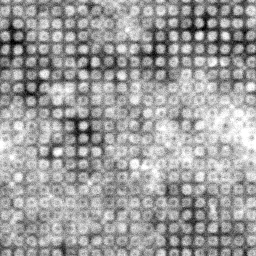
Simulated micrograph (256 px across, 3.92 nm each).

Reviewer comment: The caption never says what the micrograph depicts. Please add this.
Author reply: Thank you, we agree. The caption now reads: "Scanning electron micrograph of a regular array of raised bodies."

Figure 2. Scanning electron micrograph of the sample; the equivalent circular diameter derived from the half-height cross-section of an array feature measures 0.0345 microns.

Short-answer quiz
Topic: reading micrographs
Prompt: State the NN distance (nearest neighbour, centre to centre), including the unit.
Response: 48.8 nm